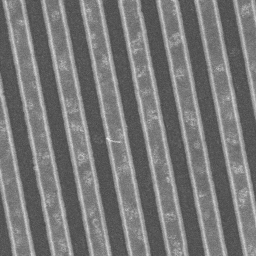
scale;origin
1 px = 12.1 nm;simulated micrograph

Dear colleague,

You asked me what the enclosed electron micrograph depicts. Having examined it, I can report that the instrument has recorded parallel lines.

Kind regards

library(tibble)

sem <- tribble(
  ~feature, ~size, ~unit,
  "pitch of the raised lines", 457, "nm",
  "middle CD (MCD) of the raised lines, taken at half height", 227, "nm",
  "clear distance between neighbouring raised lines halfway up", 227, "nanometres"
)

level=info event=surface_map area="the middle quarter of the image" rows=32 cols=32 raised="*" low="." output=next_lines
**.....*****.....*****.....****.
***.....****.....*****.....*****
***.....*****....*****.....*****
***.....*****....*****.....*****
***.....*****.....*****....*****
***.....*****.....*****.....****
****....*****.....*****.....****
****.....*****....*****.....****
****.....*****.....****.....****
****.....*****.....*****....****
****.....*****.....*****.....***
*****.....****.....*****.....***
*****.....*****....*****.....***
*****.....*****....*****.....***
*****.....*****.....****.....***
.****.....*****.....*****.....**
.*****.....****.....*****.....**
.*****.....****.....*****.....**
.*****.....****......****.....**
.*****.....*****.....****.....**
..****.....*****.....*****.....*
..****.....*****.....*****.....*
..*****.....****.....*****.....*
..*****.....*****.....****.....*
..*****.....*****.....****.....*
...****.....*****.....*****....*
...****.....*****.....*****.....
...*****.....****.....*****.....
...*****.....****......****.....
...*****.....*****.....****.....
....****.....*****.....*****....
....****.....*****.....*****....